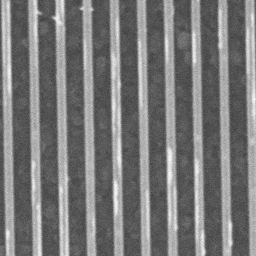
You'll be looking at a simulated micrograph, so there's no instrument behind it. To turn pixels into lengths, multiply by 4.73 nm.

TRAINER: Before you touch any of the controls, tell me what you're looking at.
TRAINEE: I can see parallel lines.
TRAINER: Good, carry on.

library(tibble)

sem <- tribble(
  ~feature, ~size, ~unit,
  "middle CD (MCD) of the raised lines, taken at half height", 36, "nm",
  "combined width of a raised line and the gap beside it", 128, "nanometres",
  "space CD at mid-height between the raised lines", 91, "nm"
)